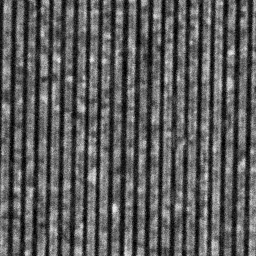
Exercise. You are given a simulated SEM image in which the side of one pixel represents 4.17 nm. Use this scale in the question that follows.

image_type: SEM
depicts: parallel lines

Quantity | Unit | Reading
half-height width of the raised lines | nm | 25.5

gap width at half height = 0.0255 um